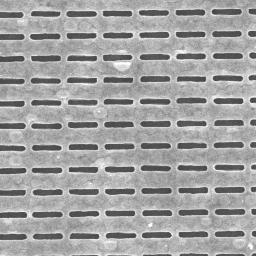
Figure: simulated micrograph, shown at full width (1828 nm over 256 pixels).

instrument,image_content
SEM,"a regular array of holes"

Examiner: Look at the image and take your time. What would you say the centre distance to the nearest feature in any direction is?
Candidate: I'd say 0.157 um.